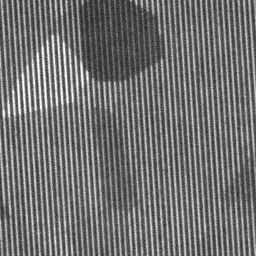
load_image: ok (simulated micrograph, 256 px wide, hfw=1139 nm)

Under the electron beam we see parallel lines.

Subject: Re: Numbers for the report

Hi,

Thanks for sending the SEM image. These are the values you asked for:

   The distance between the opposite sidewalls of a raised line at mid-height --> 0.989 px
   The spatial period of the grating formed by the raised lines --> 23.9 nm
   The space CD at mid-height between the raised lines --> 0.02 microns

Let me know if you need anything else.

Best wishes